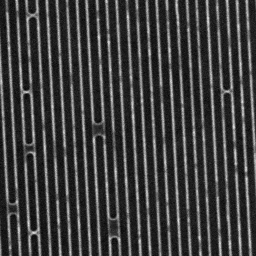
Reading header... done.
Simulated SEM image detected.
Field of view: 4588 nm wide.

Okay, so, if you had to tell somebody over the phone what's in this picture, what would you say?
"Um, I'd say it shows parallel lines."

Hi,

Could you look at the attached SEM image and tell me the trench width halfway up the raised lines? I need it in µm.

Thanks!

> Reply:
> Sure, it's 0.148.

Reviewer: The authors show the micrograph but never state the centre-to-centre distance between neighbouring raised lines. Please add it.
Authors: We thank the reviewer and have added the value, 179 nanometres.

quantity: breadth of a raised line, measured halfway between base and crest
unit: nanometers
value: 26.8